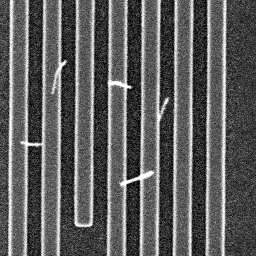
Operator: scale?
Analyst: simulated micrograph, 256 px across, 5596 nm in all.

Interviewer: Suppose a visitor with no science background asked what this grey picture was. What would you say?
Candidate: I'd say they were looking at groups of lines, slits or small figures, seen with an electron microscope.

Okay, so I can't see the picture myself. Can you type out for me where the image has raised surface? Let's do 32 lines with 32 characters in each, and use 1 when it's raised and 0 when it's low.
01100011001100110011001100110000
01100011001100110011001100110000
01100011001100110011001100110000
01100011001100110011001100110000
01100111001100110011001100110000
01100111001100110011001100110000
01100111001100110011001100110000
01100111001100110011001100110000
01100111001100110011001100110000
01100111001100110011001100110000
01100110001100110011001100110000
01100110001100110011001100110000
01100110001100110011001100110000
01100110001100110011001100110000
01100110001100110011001100110000
01100110001100110011001100110000
01100110001100110011001100110000
01100110001100110011001100110000
01100110011100110011001100110000
01100110011100110011001100110000
01100110011100110011001100110000
01100110011100110011001100110000
01100110011100110111001100110000
01100110011100110011001100110000
01100110011100110011001100110000
01100110011100110011001100110000
01100110011100110011001100110000
01100110011000110011001100110000
01100110000000110011001100110000
01100110000000110011001100110000
01100110000000110011001100110000
01100110000000110011001100110000